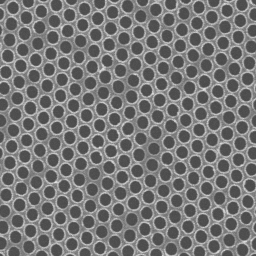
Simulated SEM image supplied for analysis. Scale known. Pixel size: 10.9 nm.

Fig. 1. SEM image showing a regular array of holes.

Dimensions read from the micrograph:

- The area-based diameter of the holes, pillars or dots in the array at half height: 133 nm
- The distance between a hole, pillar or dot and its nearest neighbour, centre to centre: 16.1 pixels